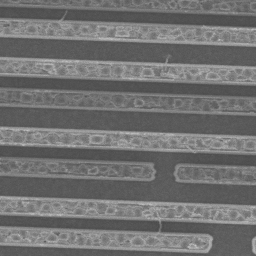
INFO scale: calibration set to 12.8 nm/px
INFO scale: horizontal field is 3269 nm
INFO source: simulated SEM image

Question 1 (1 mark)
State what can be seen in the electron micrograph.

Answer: parallel lines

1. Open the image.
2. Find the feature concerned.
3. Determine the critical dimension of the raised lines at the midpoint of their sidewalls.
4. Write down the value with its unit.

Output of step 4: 210 nm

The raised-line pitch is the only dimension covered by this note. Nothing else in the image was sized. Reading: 34.9 pixels